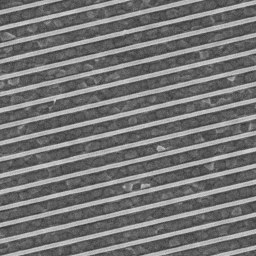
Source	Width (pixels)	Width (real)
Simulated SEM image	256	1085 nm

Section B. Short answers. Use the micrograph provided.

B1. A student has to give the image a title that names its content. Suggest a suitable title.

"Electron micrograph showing parallel lines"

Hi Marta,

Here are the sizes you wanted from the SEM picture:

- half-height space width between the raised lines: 50.1 nm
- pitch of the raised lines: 67.6 nanometers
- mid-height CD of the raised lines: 16.6 nanometres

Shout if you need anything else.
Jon